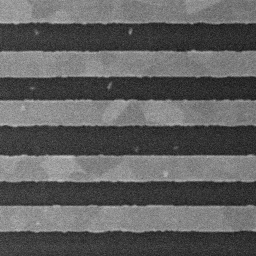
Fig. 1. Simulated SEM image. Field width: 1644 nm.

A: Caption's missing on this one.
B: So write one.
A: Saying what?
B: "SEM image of lines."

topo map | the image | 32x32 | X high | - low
XXXXXXXXXXXXXXXXXXXXXXXXXXXXXXXX
XXXXXXXXXXXXXXXXXXXXXXXXXXXXXXXX
XXXXXXXXXXXXXXXXXXXXXXXXXXXXXXXX
--------------------------------
--------------------------------
--------------------------------
XXXXXX-XXXX-XXXXXXXXXX-XXXXXXXXX
XXXXXXXXXXXXXXXXXXXXXXXXXXXXXXXX
XXXXXXXXXXXXXXXXXXXXXXXXXXXXXXXX
XXXXXXXXX---XX---XX-----X-XXX---
--------------------------------
--------------------------------
--------------------------------
XXXXXXXXXXXXXXXXXXXXXXXXXXXXXXXX
XXXXXXXXXXXXXXXXXXXXXXXXXXXXXXXX
XXXXXXXXXXXXXXXXXXXXXXXXXXXXXXXX
--------------------------------
--------------------------------
--------------------------------
--XX-X------X------------------X
XXXXXXXXXXXXXXXXXXXXXXXXXXXXXXXX
XXXXXXXXXXXXXXXXXXXXXXXXXXXXXXXX
XXXXXXXXXXXXXXXXXXXXXXXXXXXXXXXX
--------------------------------
--------------------------------
--------------------------------
XXXXXXXXXXXXXXXXXXXXXXXXXXXXXXXX
XXXXXXXXXXXXXXXXXXXXXXXXXXXXXXXX
XXXXXXXXXXXXXXXXXXXXXXXXXXXXXXXX
--------------------------------
--------------------------------
--------------------------------